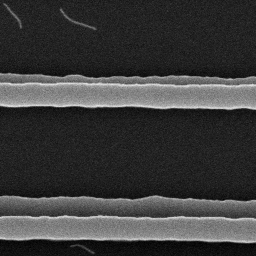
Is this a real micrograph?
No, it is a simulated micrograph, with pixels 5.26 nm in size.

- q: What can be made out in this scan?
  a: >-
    lines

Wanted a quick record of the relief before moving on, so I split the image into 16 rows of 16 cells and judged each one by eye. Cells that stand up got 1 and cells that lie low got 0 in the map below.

0000000000000000
0000000000000000
0000000000000000
0000000000000000
0000000000000000
1111111111111111
1111111111111111
0000000000000000
0000000000000000
0000000000000000
0000000000000000
0000000000000000
1111111111111000
1111111111111111
1111111111111111
0000000000000000